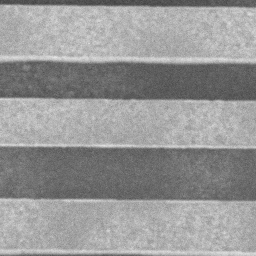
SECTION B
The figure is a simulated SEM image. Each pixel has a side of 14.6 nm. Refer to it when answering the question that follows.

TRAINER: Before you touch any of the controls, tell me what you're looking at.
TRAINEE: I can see lines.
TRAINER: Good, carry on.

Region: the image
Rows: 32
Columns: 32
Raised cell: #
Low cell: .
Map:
................................
################################
################################
################################
################################
################################
################################
................................
................................
................................
................................
................................
##############..................
################################
################################
################################
################################
################################
................................
................................
................................
................................
................................
................................
................................
################################
################################
################################
################################
################################
################################
.........................#######